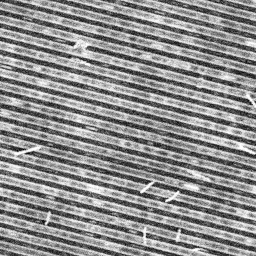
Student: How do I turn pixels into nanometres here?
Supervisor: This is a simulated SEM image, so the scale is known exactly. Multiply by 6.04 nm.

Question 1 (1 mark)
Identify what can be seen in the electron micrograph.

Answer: parallel lines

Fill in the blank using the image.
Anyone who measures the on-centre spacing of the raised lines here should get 77.7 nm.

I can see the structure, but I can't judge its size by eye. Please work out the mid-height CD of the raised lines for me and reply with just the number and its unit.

41.6 nm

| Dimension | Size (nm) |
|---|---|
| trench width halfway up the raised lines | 35.8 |